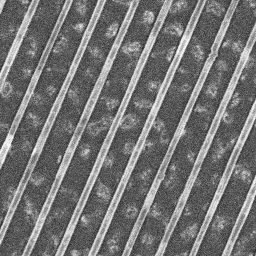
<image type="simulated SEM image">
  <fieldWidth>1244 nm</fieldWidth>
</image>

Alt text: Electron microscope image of parallel lines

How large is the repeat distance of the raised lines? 149 nanometers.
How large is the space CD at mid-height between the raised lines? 0.119 micrometres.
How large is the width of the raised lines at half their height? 30.7 nm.